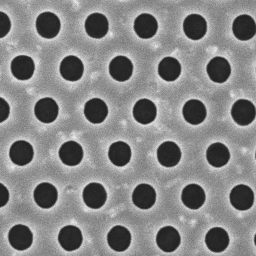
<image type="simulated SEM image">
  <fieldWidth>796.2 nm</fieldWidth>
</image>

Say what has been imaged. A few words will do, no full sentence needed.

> a regular array of holes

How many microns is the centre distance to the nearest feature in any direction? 0.152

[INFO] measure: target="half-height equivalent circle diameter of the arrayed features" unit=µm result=0.0786